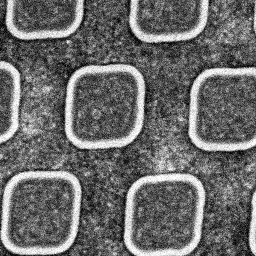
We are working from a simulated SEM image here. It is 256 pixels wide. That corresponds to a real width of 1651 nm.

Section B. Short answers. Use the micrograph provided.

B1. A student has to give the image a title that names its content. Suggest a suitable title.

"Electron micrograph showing raised bodies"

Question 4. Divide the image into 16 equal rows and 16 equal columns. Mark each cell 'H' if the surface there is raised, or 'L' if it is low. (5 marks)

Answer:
LHHHHLLLHHHHHLLL
LHHHHLLLHHHHHLLL
LLLLLLLLLLLLLLLL
LLLLLLLLLLLLLLLL
HLLLLHHHLLLLLHHH
HLLLHHHHHLLLHHHH
HLLLHHHHHLLLHHHH
HLLLHHHHHLLLHHHH
LLLLLHHHLLLLHHHH
LLLLLLLLLLLLLLLL
LLLLLLLLLLLLLLLL
LHHHHLLLLHHHLLLL
HHHHHLLLHHHHHLLL
HHHHHLLLHHHHLLLL
HHHHHLLLHHHHLLLL
LHHHLLLLHHHHLLLL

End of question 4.